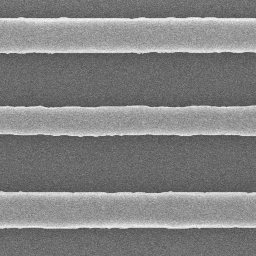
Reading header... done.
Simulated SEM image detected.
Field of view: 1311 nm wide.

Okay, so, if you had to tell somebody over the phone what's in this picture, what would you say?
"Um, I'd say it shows lines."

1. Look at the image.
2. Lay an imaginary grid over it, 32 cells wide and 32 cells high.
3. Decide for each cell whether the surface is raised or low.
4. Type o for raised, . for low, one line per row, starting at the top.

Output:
................................
................................
oooooooooooooooooooooooooooooooo
oooooooooooooooooooooooooooooooo
oooooooooooooooooooooooooooooooo
oooooooooooooooooooooooooooooooo
ooooooooooooooo.oooo.o.oooo..oo.
................................
................................
................................
................................
................................
................................
oooooooooooooooooooooooooooooooo
oooooooooooooooooooooooooooooooo
oooooooooooooooooooooooooooooooo
oooooooooooooooooooooooooooooooo
................................
................................
................................
................................
................................
................................
................................
oooooooooooooooooooooooooooooooo
oooooooooooooooooooooooooooooooo
oooooooooooooooooooooooooooooooo
oooooooooooooooooooooooooooooooo
................................
................................
................................
................................